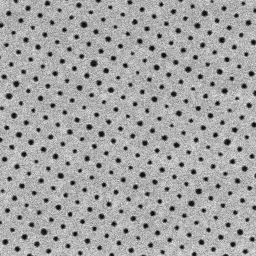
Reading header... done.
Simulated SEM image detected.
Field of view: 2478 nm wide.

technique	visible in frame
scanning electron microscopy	a regular array of holes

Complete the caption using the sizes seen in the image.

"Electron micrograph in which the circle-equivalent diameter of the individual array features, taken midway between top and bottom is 50.1 nm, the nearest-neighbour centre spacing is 136 nanometres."